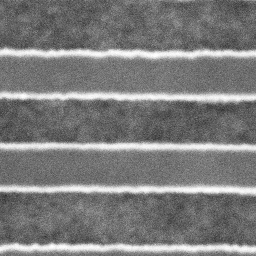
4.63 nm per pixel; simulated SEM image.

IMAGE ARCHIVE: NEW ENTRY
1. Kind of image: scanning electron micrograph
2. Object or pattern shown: lines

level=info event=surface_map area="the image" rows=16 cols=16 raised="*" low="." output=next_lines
................
................
................
****************
****************
****************
................
................
................
****************
****************
****************
................
................
................
****************